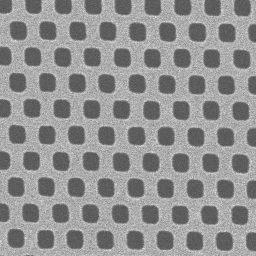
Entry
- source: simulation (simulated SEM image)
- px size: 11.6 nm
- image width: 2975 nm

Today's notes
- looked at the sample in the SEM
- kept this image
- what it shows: a regular array of holes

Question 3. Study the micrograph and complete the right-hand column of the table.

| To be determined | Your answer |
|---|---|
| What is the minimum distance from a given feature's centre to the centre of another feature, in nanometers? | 343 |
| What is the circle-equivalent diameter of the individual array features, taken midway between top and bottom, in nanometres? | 218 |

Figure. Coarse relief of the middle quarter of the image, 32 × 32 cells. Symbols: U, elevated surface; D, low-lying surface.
DUUUUUDDUUUUUDDDUUUUUDDDUUUUDDDU
UUUUUUUUUUUUUUUUUUUUUUUUUUUUUUUU
UUDDUUUUUUUUUUUUUUUUUUUUUUUUUUUU
UDDDDUUUUDDDDUUUDDDDUUUUDDDDUUUD
UDDDDUUUUDDDDUUUDDDDUUUUDDDDUUUD
UDDDDUUUUDDDDUUUDDDDUUUUDDDDUUUD
UUDDDUUUUDDDDUUUDDDDUUUUDDDDUUUD
UUUUUUUUUUUUUUUUUUUUUUUUUUUUUUUU
UUUUUUUUUUUUUUUUUUUUUUUUUUUUUUUU
DUUUUDDDDUUUUDDDUUUUDDDUUUUUDDDU
DDUUUDDDDUUUDDDDUUUUDDDDUUUDDDDU
DDUUUDDDDUUUDDDDDUUUDDDDUUUDDDDD
DUUUUDDDDUUUDDDDDUUUDDDDUUUDDDDU
DUUUUUDDUUUUUDDDUUUUDDDDUUUUDDDU
UUUUUUUUUUUUUUUUUUUUUUUUUUUUUUUU
UUDDUUUUUUDUUUUUUUUUUUUUUUUUUUUU
UDDDDUUUUDDDUUUUDDDDUUUUDDDUUUUD
UDDDDUUUDDDDDUUUDDDDUUUDDDDDUUUD
UDDDDUUUDDDDDUUUDDDDUUUDDDDDUUUD
UUDDDUUUUDDDDUUUDDDDUUUUDDDDUUUD
UUUUUUUUUUUUUUUUUUUUUUUUUDUUUUUU
UUUUUUUUUUUUUUUUUUUUUUUUUUUUUUUU
DUUUUDDDUUUUUDDDUUUUDDDUUUUUDDUU
DUUUUDDDDUUUDDDDUUUUDDDDUUUDDDDU
DUUUUDDDDUUUDDDDUUUUDDDDUUUDDDDU
DUUUUDDDDUUUDDDDUUUDDDDDUUUDDDDU
DUUUUDDDUUUUUDDDUUUUDDDUUUUUDDDU
UUUUUUUUUUUUUUUUUUUUUUUUUUUUUUUU
UUUUUUUUUUUUUUUUUDUUUUUUUUUUUUUU
UDDDDUUUUDDDUUUUDDDDUUUDDDDUUUUD
UDDDDUUUDDDDDUUUDDDDUUUDDDDUUUUD
UDDDDUUUDDDDDUUUDDDDUUUDDDDUUUUD